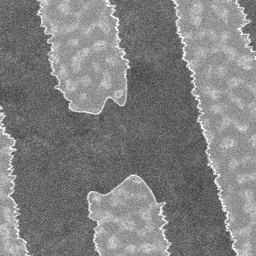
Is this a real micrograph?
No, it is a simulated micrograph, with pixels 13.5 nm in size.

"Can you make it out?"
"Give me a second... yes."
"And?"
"one or a few lines or trenches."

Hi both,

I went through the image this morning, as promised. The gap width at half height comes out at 880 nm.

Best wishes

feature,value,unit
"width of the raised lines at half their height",896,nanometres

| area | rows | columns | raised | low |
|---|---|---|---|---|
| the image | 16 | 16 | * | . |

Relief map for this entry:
***....****....*
***....****....*
***....****....*
***.....****....
***.....****....
****....****....
****...*****....
*************...
.************...
.************...
.************...
.*******.*****..
.*****....****..
.*****....****..
.*****....****..
..****....*****.